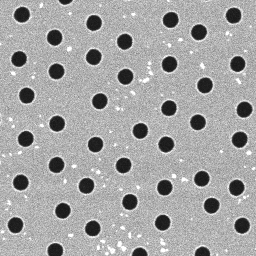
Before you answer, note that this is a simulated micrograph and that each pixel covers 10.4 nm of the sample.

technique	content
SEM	a regular array of holes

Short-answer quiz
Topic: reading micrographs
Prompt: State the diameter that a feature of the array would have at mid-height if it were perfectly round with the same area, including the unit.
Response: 0.163 µm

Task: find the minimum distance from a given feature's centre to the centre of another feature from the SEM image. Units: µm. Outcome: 0.363